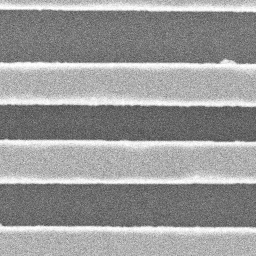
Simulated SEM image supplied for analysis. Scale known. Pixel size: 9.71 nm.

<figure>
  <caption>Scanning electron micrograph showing lines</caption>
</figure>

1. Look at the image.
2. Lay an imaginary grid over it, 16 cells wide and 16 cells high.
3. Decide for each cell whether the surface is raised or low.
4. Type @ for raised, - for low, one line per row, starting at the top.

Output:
@@@@@@@@@@@@@@@@
----------------
----------------
----------------
@@@@@@@@@@@@@@@@
@@@@@@@@@@@@@@@@
@@@@@@@@@@@@@@@@
----------------
----------------
@@@@@@@@@@@@@@@@
@@@@@@@@@@@@@@@@
----------------
----------------
----------------
@@@@@@@@@@@@@@@@
@@@@@@@@@@@@@@@@